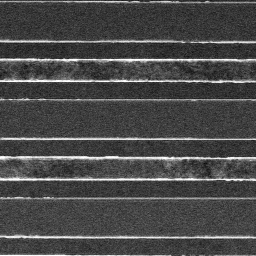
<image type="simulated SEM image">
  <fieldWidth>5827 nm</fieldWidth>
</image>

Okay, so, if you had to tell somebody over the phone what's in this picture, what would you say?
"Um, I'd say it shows lines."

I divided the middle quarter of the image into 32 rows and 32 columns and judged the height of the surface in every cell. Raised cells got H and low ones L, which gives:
HHHHHHHHHHHHHHHHHHHHHHHHHHHHHHHH
HHHHHHHHHHHHHHHHHHHHHHHHHHHHHHHH
HHHHHHHHHHHHHHHHHHHHHHHHHHHHHHHH
HHHHHHHHHHHHHHHHHHHHHHHHHHHHHHHH
LLLLLLLLLLLLLLLLLLLLLLLLLLLLLLLL
LLLLLLLLLLLLLLLLLLLLLLLLLLLLLLLL
LLLLLLLLLLLLLLLLLLLLLLLLLLLLLLLL
LLLLLLLLLLLLLLLLLLLLLLLLLLLLLLLL
LLLLLLLLLLLLLLLLLLLLLLLLLLLLLLLL
HHHHHHHHHHHHHHHHHHHHHHHHHHHHHHHH
HHHHHHHHHHHHHHHHHHHHHHHHHHHHHHHH
HHHHHHHHHHHHHHHHHHHHHHHHHHHHHHHH
HHHHHHHHHHHHHHHHHHHHHHHHHHHHHHHH
HHHHHHHHHHHHHHHHHHHHHHHHHHHHHHHH
HHHHHHHHHHHHHHHHHHHHHHHHHHHHHHHH
HHHHHHHHHHHHHHHHHHHHHHHHHHHHHHHH
HHHHHHHHHHHHHHHHHHHHHHHHHHHHHHHH
HHHHHHHHHHHHHHHHHHHHHHHHHHHHHHHH
HHHHHHHHHHHHHHHHHHHHHHHHHHHHHHHH
LLLLLLLLLLLLLLLLLLLLLLLLLLLLLLLL
LLLLLLLLLLLLLLLLLLLLLLLLLLLLLLLL
LLLLLLLLLLLLLLLLLLLLLLLLLLLLLLLL
LLLLLLLLLLLLLLLLLLLLLLLLLLLLLLLL
LLLLLLLLLLLLLLLLLLLLLLLLLLLLLLLL
HHHHHHHHHHHHHHHHHHHHHHHHHHHHHHHH
HHHHHHHHHHHHHHHHHHHHHHHHHHHHHHHH
HHHHHHHHHHHHHHHHHHHHHHHHHHHHHHHH
HHHHHHHHHHHHHHHHHHHHHHHHHHHHHHHH
HHHHHHHHHHHHHHHHHHHHHHHHHHHHHHHH
LLLLLLLLLLLLLLLLLLLLLLLLLLLLLLLL
LLLLLLLLLLLLLLLLLLLLLLLLLLLLLLLL
LLLLLLLLLLLLLLLLLLLLLLLLLLLLLLLL